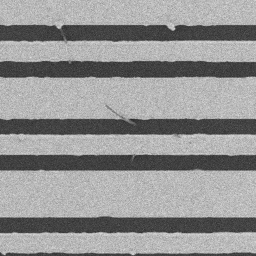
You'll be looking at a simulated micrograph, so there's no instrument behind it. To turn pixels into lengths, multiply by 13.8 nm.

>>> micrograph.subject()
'lines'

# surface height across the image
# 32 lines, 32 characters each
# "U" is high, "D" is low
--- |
UUUUUUUUUUUUUUUUUUUUUUUUUUUUUUUU
UUUUUUUUUUUUUUUUUUUUUUUUUUUUUUUU
UUUUUUUUUUUUUUUUUUUUUUUUUUUUUUUU
DDDDDDDDDDDDDDDDDDDDDUDDDDDDDDDD
DDDDDDDDDDDDDDDDDDDDDDDDDDDDDDDD
UUUUUUUUUUUUUUUUUUUUUUUUUUUUUUUU
UUUUUUUUUUUUUUUUUUUUUUUUUUUUUUUU
UUUUUUUUUUUUUUUUUUUUUUUUUUUUUUUU
DDDDDDDDDDDDDDDDDDDDDDDDDDDDDDDD
DDDDDDDDDDDDDDDDDDDDDDDDDDDDDDDD
UUUUUUUUUUUUUUUUUUUUUUUUUUUUUUUU
UUUUUUUUUUUUUUUUUUUUUUUUUUUUUUUU
UUUUUUUUUUUUUUUUUUUUUUUUUUUUUUUU
UUUUUUUUUUUUUUUUUUUUUUUUUUUUUUUU
UUUUUUUUUUUUUUUUUUUUUUUUUUUUUUUU
DDDDDDDDDDDDDDDDDDDDDDDDDDDDDDDD
DDDDDDDDDDDDDDDDDDDDDDDDDDDDDDDD
UUUUUUUUUUUUUUUUUUUUUUUUUUUUUUUU
UUUUUUUUUUUUUUUUUUUUUUUUUUUUUUUU
DDDDDDDDDDDDDDDDDDDDDDDDDDDDDDDD
DDDDDDDDDDDDDDDDDDDDDDDDDDDDDDDD
UUUUUUUUUUUUUUUUUUUUUUUUUUUUUUUU
UUUUUUUUUUUUUUUUUUUUUUUUUUUUUUUU
UUUUUUUUUUUUUUUUUUUUUUUUUUUUUUUU
UUUUUUUUUUUUUUUUUUUUUUUUUUUUUUUU
UUUUUUUUUUUUUUUUUUUUUUUUUUUUUUUU
UUUUUUUUUUUUUUUUUUUUUUUUUUUUUUUU
DDDDDDDDDDDDDDDDDDDDDDDDDDDDDDDD
DDDDDDDDDDDDDDDDDDDDDDDDDDDDDDDD
UUUUUUUUUUUUUUUUUUUUUUUUUUUUUUUU
UUUUUUUUUUUUUUUUUUUUUUUUUUUUUUUU
UDUUUDDDUUUUUUUUUUDDUUUUUUUUUDDU